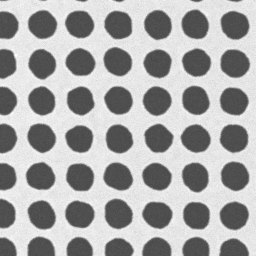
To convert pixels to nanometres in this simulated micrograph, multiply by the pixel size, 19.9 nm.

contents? a regular array of holes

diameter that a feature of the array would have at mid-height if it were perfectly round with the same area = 0.577 um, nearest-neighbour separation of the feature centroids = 744 nanometres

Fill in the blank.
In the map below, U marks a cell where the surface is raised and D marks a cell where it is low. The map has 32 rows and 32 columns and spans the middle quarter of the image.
DDDDDDDDUUDDDDDDDUUUDDDDDDDUUUDD
UDDDDDDDUUUDDDDDDUUUDDDDDDUUUUDD
UUDDDDDUUUUUDDDDUUUUUDDDDDUUUUUD
UUUUUUUUUUUUUUUUUUUUUUUDDUUUUUUU
UUUUUUUUUUUUUUUUUUUUUUUUUUUUUUUU
UUUUUUUUUUUUUDUUUUUUUUDDUUUUUUUU
UUDDDDUUUUUDDDDDUUUUUDDDDUUUUUDD
UDDDDDDUUUDDDDDDDUUUDDDDDDUUUUDD
UDDDDDDUUUDDDDDDDUUUDDDDDDDUUDDD
UDDDDDDDUUDDDDDDDUUUDDDDDDDUUDDD
UDDDDDDDUUUDDDDDDUUUDDDDDDDUUUDD
UDDDDDDUUUUDDDDDDUUUUDDDDDUUUUDD
UUUDDDUUUUUUDDDUUUUUUUDDDUUUUUUU
UUUUUUUUUUUUUUUUUUUUUUUUUUUUUUUU
UUUUUUUUUUUUUUUUUUUUUUUUUUUUUUUU
UUUDDUUUUUUUDDDUUUUUUUDDDUUUUUUD
UDDDDDDUUUUDDDDDUUUUUDDDDDUUUUDD
DDDDDDDUUUUDDDDDDUUUDDDDDDDUUDDD
DDDDDDDDUUDDDDDDDUUUDDDDDDDUUDDD
UDDDDDDUUUDDDDDDDDUUDDDDDDDUUDDD
UDDDDDDUUUUDDDDDDUUUUDDDDDDUUUDD
UUDDDDUUUUUDDDDDUUUUUUDDDDUUUUUD
UUUUUUUUUUUUUUUUUUUUUUUUUUUUUUUU
UUUUUUUUUUUUUUUUUUUUUUUUUUUUUUUU
UUUUUUUUUUUUDDUUUUUUUUUUUUUUUUUU
UDDDDDUUUUUDDDDDUUUUUDDDDUUUUUDD
UDDDDDDUUUDDDDDDDUUUDDDDDDUUUUDD
UDDDDDDDUUDDDDDDDUUDDDDDDDDUUDDD
DDDDDDDDUUDDDDDDDUUUDDDDDDDUUUDD
UDDDDDDDUUDDDDDDDUUUDDDDDDDUUUDD
UDDDDDDUUUUDDDDDDUUUUDDDDDUUUUDD
UUUDDDUUUUUUUUDUUUUUUUUDDUUUUUUD